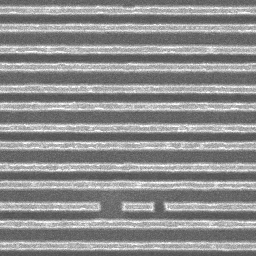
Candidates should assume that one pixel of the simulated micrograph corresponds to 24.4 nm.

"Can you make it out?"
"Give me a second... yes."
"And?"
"parallel lines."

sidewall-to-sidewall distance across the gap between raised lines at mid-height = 291 nm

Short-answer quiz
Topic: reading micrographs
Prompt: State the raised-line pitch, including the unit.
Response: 478 nm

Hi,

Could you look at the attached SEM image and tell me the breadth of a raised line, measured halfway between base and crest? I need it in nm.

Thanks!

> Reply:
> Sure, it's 228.